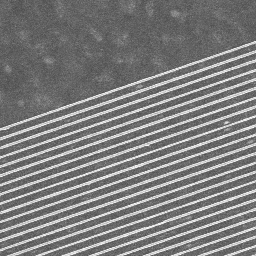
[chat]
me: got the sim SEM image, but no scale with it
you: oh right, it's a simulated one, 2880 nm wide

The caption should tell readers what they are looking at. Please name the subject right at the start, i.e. parallel lines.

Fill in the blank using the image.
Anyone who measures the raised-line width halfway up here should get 25.3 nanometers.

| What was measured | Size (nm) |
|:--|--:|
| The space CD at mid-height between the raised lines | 77.2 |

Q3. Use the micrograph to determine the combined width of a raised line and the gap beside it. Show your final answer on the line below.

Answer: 0.0988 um